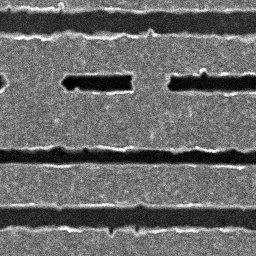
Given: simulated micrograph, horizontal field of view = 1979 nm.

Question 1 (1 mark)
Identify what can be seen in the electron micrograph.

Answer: one or a few lines or trenches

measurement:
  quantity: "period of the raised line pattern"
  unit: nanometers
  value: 503